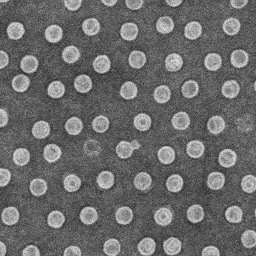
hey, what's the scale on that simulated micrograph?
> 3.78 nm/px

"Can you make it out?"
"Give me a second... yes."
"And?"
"a regular array of raised bodies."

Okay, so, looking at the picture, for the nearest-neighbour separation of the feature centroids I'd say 112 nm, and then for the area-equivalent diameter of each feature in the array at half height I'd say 60.6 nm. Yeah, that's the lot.